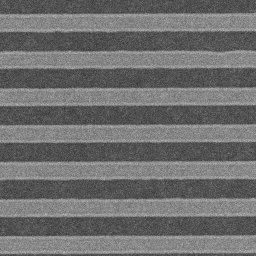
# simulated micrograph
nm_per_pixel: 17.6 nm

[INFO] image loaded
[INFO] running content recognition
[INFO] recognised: parallel lines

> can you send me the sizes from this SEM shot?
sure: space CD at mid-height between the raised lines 0.396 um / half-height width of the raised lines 264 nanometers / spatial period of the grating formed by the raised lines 651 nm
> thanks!